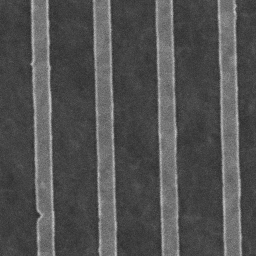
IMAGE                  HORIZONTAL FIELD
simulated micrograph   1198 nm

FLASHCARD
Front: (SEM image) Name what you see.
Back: parallel lines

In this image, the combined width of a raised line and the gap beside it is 292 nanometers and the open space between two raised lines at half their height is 217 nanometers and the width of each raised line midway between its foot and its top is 74.8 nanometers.